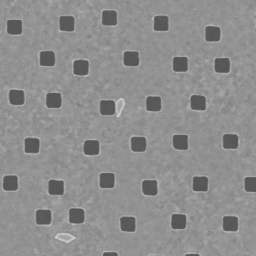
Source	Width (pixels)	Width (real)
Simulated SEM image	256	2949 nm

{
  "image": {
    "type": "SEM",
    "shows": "a regular array of holes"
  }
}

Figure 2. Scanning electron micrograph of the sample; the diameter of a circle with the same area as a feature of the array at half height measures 193 nm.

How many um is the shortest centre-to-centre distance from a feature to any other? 0.486